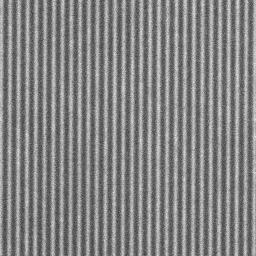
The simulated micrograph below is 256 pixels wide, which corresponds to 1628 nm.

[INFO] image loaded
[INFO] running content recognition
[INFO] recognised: parallel lines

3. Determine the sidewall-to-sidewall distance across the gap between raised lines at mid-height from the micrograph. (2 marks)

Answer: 41.4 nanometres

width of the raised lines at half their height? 0.0159 micrometres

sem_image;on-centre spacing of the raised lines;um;0.0557